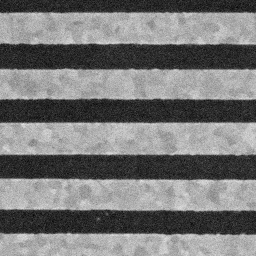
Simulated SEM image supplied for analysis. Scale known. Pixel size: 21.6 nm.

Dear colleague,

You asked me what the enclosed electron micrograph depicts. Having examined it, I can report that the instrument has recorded lines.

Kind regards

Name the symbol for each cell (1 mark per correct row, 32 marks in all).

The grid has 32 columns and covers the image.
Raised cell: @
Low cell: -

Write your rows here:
--------------------------------
--------------------------------
@@@@@@@@@@@@@@@@@@@@@@@@@@@@@@@@
@@@@@@@@@@@@@@@@@@@@@@@@@@@@@@@@
@@@@@@@@@@@@@@@@@@@@@@@@@@@@@@@@
--------------------------------
--------------------------------
--------------------------------
--------------------------------
@@@@@@@@@@@@@@@@@@@@@@@@@@@@@@@@
@@@@@@@@@@@@@@@@@@@@@@@@@@@@@@@@
@@@@@@@@@@@@@@@@@@@@@@@@@@@@@@@@
--------------------------------
--------------------------------
--------------------------------
@@@@@@@@@@@@@@@@@@@@@@@@@@@@@@@@
@@@@@@@@@@@@@@@@@@@@@@@@@@@@@@@@
@@@@@@@@@@@@@@@@@@@@@@@@@@@@@@@@
@@@@@@@@@@@@@@@@@@@@@@@@@@@@@@@@
--------------------------------
--------------------------------
--------------------------------
@@@@@@@@@@--@-------------------
@@@@@@@@@@@@@@@@@@@@@@@@@@@@@@@@
@@@@@@@@@@@@@@@@@@@@@@@@@@@@@@@@
@@@@@@@@@@@@@@@@@@@@@@@@@@@@@@@@
--------------------------------
--------------------------------
--------------------------------
@@@@@@@@@@@@@@@@@@@@@@@@@@@@@@@@
@@@@@@@@@@@@@@@@@@@@@@@@@@@@@@@@
@@@@@@@@@@@@@@@@@@@@@@@@@@@@@@@@